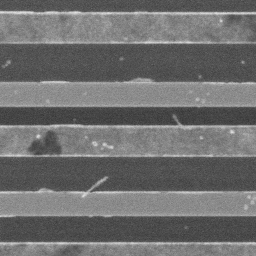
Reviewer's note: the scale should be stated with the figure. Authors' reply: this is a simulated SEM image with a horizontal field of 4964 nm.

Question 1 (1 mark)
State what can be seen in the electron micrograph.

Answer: lines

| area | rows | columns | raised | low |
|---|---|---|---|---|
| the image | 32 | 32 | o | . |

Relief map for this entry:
................................
................................
oooooooooooooooooooooooooooooooo
oooooooooooooooooooooooooooooooo
oooooooooooooooooooooooooooooooo
................................
................................
................................
................................
................................
oooooooooooooooooooooooooooooooo
oooooooooooooooooooooooooooooooo
oooooooooooooooooooooooooooooooo
................................
................................
................................
oooooooooooooooooooooooooooooooo
oooooooooooooooooooooooooooooooo
oooooooooooooooooooooooooooooooo
................................
................................
................................
................................
................................
oooooooooooooooooooooooooooooooo
oooooooooooooooooooooooooooooooo
oooooooooooooooooooooooooooooooo
................................
................................
................................
oooooooooooooooooooooooooooooooo
oooooooooooooooooooooooooooooooo